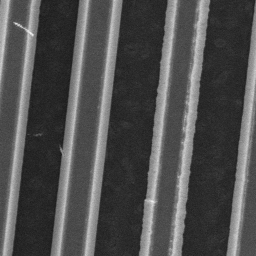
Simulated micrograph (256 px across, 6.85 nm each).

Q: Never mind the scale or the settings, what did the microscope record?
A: one or a few lines or trenches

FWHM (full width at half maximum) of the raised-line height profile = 228 nanometers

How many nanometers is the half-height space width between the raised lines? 368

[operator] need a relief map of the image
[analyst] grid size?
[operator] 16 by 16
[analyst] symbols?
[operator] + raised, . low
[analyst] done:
++...++....++...
++...++....++...
++...++....++...
++...++...++....
++...++...++....
++...++...++....
++...++...++....
+...+++...++...+
+...++....++...+
+...++....++...+
+...++....++...+
+...++...++....+
+...++...++....+
+...++...++....+
+...++...++....+
+..+++...++...++